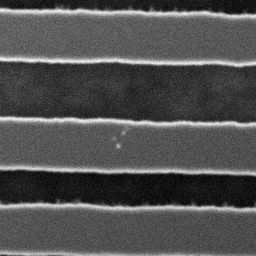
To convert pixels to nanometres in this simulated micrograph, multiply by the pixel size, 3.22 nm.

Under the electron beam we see lines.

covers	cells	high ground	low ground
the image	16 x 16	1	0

0000000000000000
1111111111111111
1111111111111111
1111111111111111
0000000000000000
0000000000000000
0000000000000000
1111111000000000
1111111111111111
1111111111111111
1111111111111111
0000000000000000
0000000000000000
1111111111111111
1111111111111111
1111111111111111